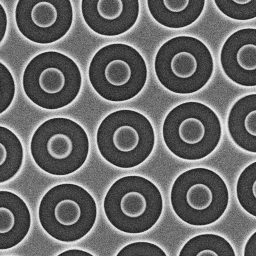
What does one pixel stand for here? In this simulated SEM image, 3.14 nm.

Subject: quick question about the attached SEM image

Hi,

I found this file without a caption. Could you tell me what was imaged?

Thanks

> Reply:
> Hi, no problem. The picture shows an array of small figures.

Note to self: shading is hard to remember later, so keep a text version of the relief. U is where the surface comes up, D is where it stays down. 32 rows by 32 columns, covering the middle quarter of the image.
DDDDUUDDDDDUUUUUDDDDDUUDDDDUUUUU
DDDDUUDDDDUUUUUUUDDDDUUDDDDUUUUU
DDDDUUDDDDUUUUUUUDDDDUUDDDDDUUUU
DDDDDUDDDDDUUUUUDDDDDUUDDDDDDDDD
DDDDUUUDDDDUUUUDDDDDUUUUDDDDDDDD
DDDDUUUDDDDDDDDDDDDDUUUUUDDDDDDD
DDDDUUUUDDDDDDDDDDDUUUUUUUDDDDDD
DDDDUUUUUDDDDDDDDDUUUUUUUUUUUUDU
DDDUUUUUUUDDDDDDDUUUUUUUUUUUUUUU
DDUUUUUUUUUUUUUUUUUUUUUUUUUUUUUD
UUUUUUUUUUUUUUUUUUUUUUUUUUUUDDDD
UUUUUUUUUUUUUUDDDUUUUUUUUUUDDDDD
UUUUUUUUUUUDDDDDDDDUUUUUUUDDDDDD
UUUUUUUUUUDDDDDDDDDDDUUUUDDDDDDD
DDDUUUUUUDDDDDDDDDDDDDUUUDDDDDUU
DDDDUUUUUDDDDDDDDDDDDDUUUDDDDUUU
DDDDDUUUDDDDDUUUUUDDDDDUUDDDDUUU
DDDDDDUUDDDDDUUUUUDDDDDUUDDDDUUU
UDDDDDUUDDDDDUUUUUUDDDDUUDDDDUUU
UUDDDDUUDDDDDUUUUUDDDDDUUDDDDDDU
UUDDDDUUDDDDDUUUUUDDDDDUUUDDDDDD
UUDDDDUUUDDDDDUUUDDDDDUUUUDDDDDD
UDDDDDUUUDDDDDDDDDDDDDUUUUUDDDDD
DDDDDDUUUUDDDDDDDDDDDUUUUUUUUDDD
DDDDDUUUUUUDDDDDDDDDUUUUUUUUUUUU
DDDDUUUUUUUUUDDDDDUUUUUUUUUUUUUU
DDDUUUUUUUUUUUUUUUUUUUUUUUUUUUUD
DUUUUUUUUUUUUUUUUUUUUUUUUUUUUDDD
UUUUUUUUUUUUUUDDDDDDUUUUUUUUDDDD
UUUUUUUUUUUUUDDDDDDDDDUUUUUDDDDD
DDDDUUUUUUUUDDDDDDDDDDDUUUUDDDDD
DDDDDUUUUUUDDDDDDDDDDDDDUUUDDDDU